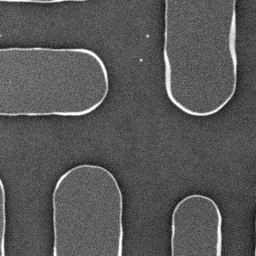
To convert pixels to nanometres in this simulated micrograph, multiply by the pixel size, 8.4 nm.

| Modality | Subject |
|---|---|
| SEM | groups of lines, slits or small figures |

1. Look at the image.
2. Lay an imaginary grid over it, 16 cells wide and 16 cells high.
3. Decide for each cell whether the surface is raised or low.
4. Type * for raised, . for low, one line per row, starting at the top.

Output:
..........*****.
..........*****.
..........*****.
******....*****.
*******...*****.
*******....****.
******.....***..
................
................
................
.....*..........
....***.........
...*****....*...
...*****...***..
...*****...***..
...*****...***..